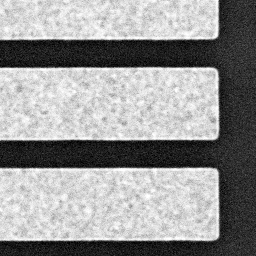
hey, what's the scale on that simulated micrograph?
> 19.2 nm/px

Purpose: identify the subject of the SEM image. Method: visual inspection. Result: wiring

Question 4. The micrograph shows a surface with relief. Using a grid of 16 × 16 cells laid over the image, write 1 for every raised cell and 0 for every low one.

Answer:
1111111111111100
1111111111111100
0000000000000000
0000000000000000
1111111111111000
1111111111111100
1111111111111100
1111111111111100
1111111111111000
0000000000000000
0000000000000000
1111111111111100
1111111111111100
1111111111111100
1111111111111100
0000000000000000